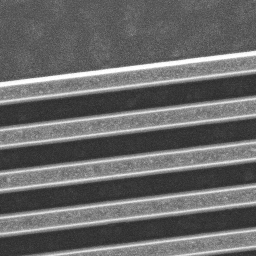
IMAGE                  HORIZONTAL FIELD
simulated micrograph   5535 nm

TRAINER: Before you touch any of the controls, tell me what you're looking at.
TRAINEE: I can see parallel lines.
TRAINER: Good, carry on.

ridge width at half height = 426 nanometres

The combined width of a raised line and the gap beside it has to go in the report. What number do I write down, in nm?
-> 945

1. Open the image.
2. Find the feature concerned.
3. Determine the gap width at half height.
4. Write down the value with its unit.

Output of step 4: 528 nm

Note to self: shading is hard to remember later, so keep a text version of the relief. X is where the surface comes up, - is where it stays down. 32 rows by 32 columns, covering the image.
--------------------------------
--------------------------------
--------------------------------
--------------------------------
--------------------------------
--------------------------------
--------------------------------
------------------------XXXXXXXX
----------------XXXXXXXXXXXXXXXX
--------XXXXXXXXXXXXXXXXXXXX----
XXXXXXXXXXXXXXXXXXXX------------
XXXXXXXXXXXX--------------------
XXXX-------------------------XXX
---------------------XXXXXXXXXXX
-------------XXXXXXXXXXXXXXXXXXX
-----XXXXXXXXXXXXXXXXXXX--------
XXXXXXXXXXXXXXXX----------------
XXXXXXXX------------------------
-------------------------XXXXXXX
-----------------XXXXXXXXXXXXXXX
--------XXXXXXXXXXXXXXXXXXXXX---
XXXXXXXXXXXXXXXXXXXX------------
XXXXXXXXXXXX--------------------
XXXX------------------------XXXX
--------------------XXXXXXXXXXXX
------------XXXXXXXXXXXXXXXXXXXX
----XXXXXXXXXXXXXXXXXXXX--------
XXXXXXXXXXXXXXXX----------------
XXXXXXXX------------------------
-------------------------XXXXXXX
-----------------XXXXXXXXXXXXXXX
---------XXXXXXXXXXXXXXXXXXX----